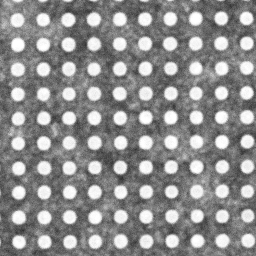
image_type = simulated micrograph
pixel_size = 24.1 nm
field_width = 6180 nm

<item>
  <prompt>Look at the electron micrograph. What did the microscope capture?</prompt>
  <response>a regular array of raised bodies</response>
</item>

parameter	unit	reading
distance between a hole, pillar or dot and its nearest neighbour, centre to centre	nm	592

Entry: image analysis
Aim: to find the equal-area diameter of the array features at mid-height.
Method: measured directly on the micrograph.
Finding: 295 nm